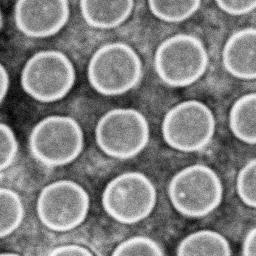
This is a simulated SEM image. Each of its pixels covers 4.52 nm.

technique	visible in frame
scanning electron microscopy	a regular array of raised bodies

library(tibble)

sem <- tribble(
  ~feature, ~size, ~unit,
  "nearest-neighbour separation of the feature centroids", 294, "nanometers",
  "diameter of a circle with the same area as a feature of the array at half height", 0.22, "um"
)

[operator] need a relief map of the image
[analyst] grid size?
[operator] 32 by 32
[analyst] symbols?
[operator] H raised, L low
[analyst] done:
LLHHHHHHLLHHHHHHLLLHHHHHHLLHHHHH
LLHHHHHHLLHHHHHHLLLHHHHHLLLLLHLL
LLHHHHHHLLLHHHHLLLLLLHHLLLLLLLLL
LLLHHHHLLLLLLLLLLLLLLLLLLLLLLLLL
LLLLLLLLLLLLLLLLLLLLLLLLLLLLLHHH
LLLLLLLLLLLLLLLLLLLLLHHHHLLLHHHH
LLLLLLLLLLLLHHHHHLLLHHHHHLLLHHHH
LLLLHHHHLLLLHHHHHLLLHHHHHHLLHHHH
LLLHHHHHHLLHHHHHHLLLHHHHHHLLHHHH
HLLHHHHHHLLHHHHHHLLLHHHHHLLLLLHH
HLLHHHHHHLLLHHHHHLLLLHHLLLLLLLLL
HLLLHHHHLLLLLHHLLLLLLLLLLLLLLLLL
LLLLLLLLLLLLLLLLLLLLLLLLLLLLLLHH
LLLLLLLLLLLLLLLLLLLLLLHHHHLLLHHH
LLLLLLLLLLLLLHHHHHLLLHHHHHLLLHHH
LLLLLHHHHLLLHHHHHHLLLHHHHHHLLHHH
HLLLHHHHHHLLHHHHHHLLLHHHHHHLLHHH
HHLLHHHHHHLLHHHHHHLLLHHHHHLLLLLH
HHLLHHHHHHLLLHHHHHLLLLHHHLLLLLLL
HHLLLHHHHLLLLLLHLLLLLLLLLLLLLLLL
HLLLLLLLLLLLLLLLLLLLLLLLLLLLLLLH
LLLLLLLLLLLLLLLLLLLLLLLHHHLLLLHH
LLLLLLLLLLLLLLHHHHLLLLHHHHHLLLHH
LLLLLLHHHHLLLHHHHHHLLHHHHHHLLLHH
HHLLLHHHHHHLLHHHHHHLLHHHHHHLLLHH
HHLLLHHHHHHLLHHHHHHLLLHHHHHLLLLH
HHHLLHHHHHHLLLHHHHHLLLLHHHLLLLLL
HHHLLHHHHHLLLLLHHLLLLLLLLLLLLLLL
HHLLLLLHHLLLLLLLLLLLLLLLLLLLLLLL
LLLLLLLLLLLLLLLLLLLLLLLLHHHLLLLH
LLLLLLLLLLLLLLLHHHHLLLLHHHHHLLLH
LLLLLLLHHHHLLLHHHHHHLLHHHHHHHLLH